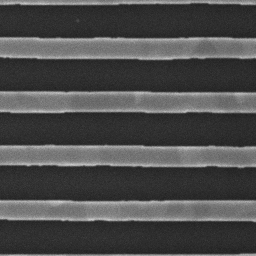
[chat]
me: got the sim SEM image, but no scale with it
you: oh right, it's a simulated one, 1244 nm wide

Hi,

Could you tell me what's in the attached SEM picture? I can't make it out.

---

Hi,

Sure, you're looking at lines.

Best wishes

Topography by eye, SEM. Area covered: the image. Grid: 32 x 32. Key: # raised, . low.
#..############................#
................................
................................
................................
................................
################################
################################
................................
................................
................................
................................
................................
################################
################################
................................
................................
................................
................................
################################
################################
################################
................................
................................
................................
................................
################################
################################
.........##..###.###############
................................
................................
................................
................................